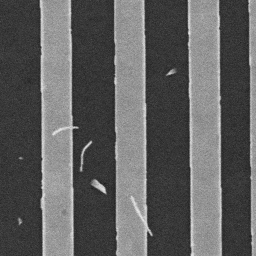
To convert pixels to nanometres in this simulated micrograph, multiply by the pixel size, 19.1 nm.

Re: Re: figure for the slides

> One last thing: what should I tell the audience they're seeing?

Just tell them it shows lines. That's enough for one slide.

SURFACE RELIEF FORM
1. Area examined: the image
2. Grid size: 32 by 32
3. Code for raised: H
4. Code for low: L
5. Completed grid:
LLLLLHHHHLLLLLHHHHLLLLLLHHHLLLLH
LLLLLHHHHLLLLLHHHHLLLLLLHHHLLLLH
LLLLLHHHHLLLLLHHHHLLLLLLHHHLLLLH
LLLLLHHHHLLLLLHHHHLLLLLLHHHLLLLH
LLLLLHHHHLLLLLHHHHLLLLLLHHHLLLLH
LLLLLHHHHLLLLLHHHHLLLLLLHHHLLLLH
LLLLLHHHHLLLLLHHHHLLLLLLHHHLLLLH
LLLLLHHHHLLLLLHHHHLLLLLLHHHLLLLH
LLLLLHHHHLLLLLHHHHLLLLLLHHHLLLLH
LLLLLHHHHLLLLLHHHHLLLLLLHHHLLLLH
LLLLLHHHHLLLLLHHHHLLLLLLHHHLLLLH
LLLLLHHHHLLLLLHHHHLLLLLLHHHLLLLH
LLLLLHHHHLLLLLHHHHLLLLLLHHHLLLLH
LLLLLHHHHLLLLLHHHHLLLLLLHHHLLLLH
LLLLLHHHHLLLLLHHHHLLLLLLHHHLLLLH
LLLLLHHHHLLLLLHHHHLLLLLLHHHHLLLH
LLLLLHHHHLLLLLHHHHLLLLLLHHHHLLLH
LLLLLHHHHLLLLLHHHHLLLLLLHHHHLLLH
LLLLLHHHHLLLLLHHHHLLLLLLHHHHLLLH
LLLLLHHHHLLLLLHHHHLLLLLLHHHHLLLH
LLLLLHHHHLLLLLLHHHLLLLLLHHHHLLLH
LLLLLHHHHLLLLLLHHHLLLLLLHHHHLLLH
LLLLLHHHHLLLLLLHHHLLLLLLHHHHLLLH
LLLLLHHHHLLLHLLHHHLLLLLLHHHHLLLH
LLLLLHHHHLLLLLLHHHLLLLLLHHHHLLLH
LLLLLHHHHLLLLLLHHHLLLLLLHHHHLLLH
LLLLLHHHHLLLLLLHHHLLLLLLHHHHLLLH
LLLLLHHHHLLLLLLHHHLLLLLLHHHHLLLH
LLLLLHHHHLLLLLLHHHLLLLLLHHHHLLLH
LLLLLHHHHLLLLLLHHHLLLLLLHHHHLLLH
LLLLLHHHHLLLLLLHHHLLLLLLHHHHLLLH
LLLLLHHHHLLLLLLHHHLLLLLLHHHHLLLL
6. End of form